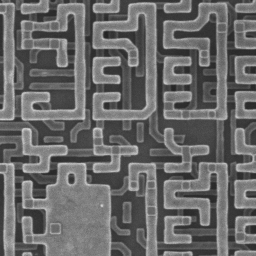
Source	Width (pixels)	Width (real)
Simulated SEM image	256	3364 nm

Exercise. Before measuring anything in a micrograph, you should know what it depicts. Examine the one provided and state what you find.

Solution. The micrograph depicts wiring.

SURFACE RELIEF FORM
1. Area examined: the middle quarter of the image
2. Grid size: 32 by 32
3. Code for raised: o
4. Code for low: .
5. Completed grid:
o..oo..oooo.....oo..ooo..ooo....
...oo..ooo..........ooo..oo.....
...oo..ooo..........ooo..ooo....
...oo..ooooooo......ooo..ooooooo
...oo..ooooooo......ooo..ooooooo
...oo...............ooo.........
...oo...............ooo.........
...oo..ooooooo......ooo..ooooooo
...oo..ooooooo.......oo..ooooooo
...oo..ooo...........oo..ooo....
...oo..ooo..........ooo..oo.....
ooooo..oooooooooo..oooo..oooo...
ooooo..ooooooooooooooo...ooooooo
ooooo..oooooooooooooo....ooooooo
................................
................................
.......oo................oo.....
.......ooo...............oo.....
.......ooo...............oo.....
.......ooo...............ooo....
.......ooooooooooo.......ooooooo
o......ooooooooooo........oooooo
o.......oooooooooo..........oooo
............oo................oo
............oo...............ooo
ooooo..ooooooo..ooooooo..ooooooo
ooooo..ooooooo..ooooooo..ooooooo
ooooo...........ooo..oo.........
o..oo...........ooo..oo.........
o..ooo..........ooo..oo..ooooooo
ooooooooooo.....ooo.ooo..ooooooo
ooooooooooo.....oo..ooo..ooooooo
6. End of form